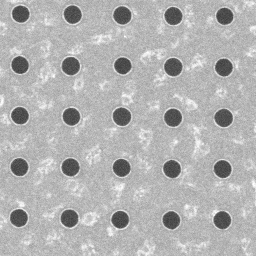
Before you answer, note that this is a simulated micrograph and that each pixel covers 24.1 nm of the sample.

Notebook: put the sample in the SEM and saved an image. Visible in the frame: a regular array of holes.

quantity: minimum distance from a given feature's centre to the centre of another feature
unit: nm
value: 1210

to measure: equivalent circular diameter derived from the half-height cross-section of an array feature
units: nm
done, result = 453